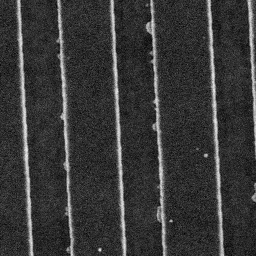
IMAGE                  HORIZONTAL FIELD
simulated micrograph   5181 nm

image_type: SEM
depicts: lines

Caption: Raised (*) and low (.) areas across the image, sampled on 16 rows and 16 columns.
*...***..****...
*...***...***...
*...***...***...
*...***...***...
*...***...***...
*...***...***...
**..***...***...
**..***...****..
**..***...****..
**..****..****..
**..****..****..
**..****..****..
**..****..****..
**..****..****..
**..****..****..
**..****..****..